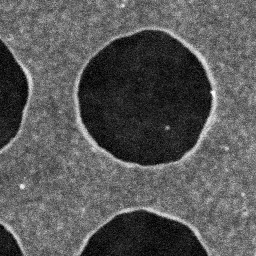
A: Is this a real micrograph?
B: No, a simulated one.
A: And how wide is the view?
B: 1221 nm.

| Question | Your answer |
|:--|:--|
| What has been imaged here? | holes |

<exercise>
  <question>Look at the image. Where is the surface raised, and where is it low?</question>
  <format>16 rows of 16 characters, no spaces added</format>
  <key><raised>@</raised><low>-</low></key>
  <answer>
@@@@@@@@@@@@@@@@
@@@@@@@@@@@@@@@@
@@@@@@@----@@@@@
-@@@@@------@@@@
--@@@--------@@@
--@@@--------@@@
--@@@--------@@@
-@@@@--------@@@
-@@@@@-------@@@
@@@@@@@-----@@@@
@@@@@@@@@@@@@@@@
@@@@@@@@@@@@@@@@
@@@@@@@@@@@@@@@@
@@@@@@@---@@@@@@
-@@@@@------@@@@
-@@@@--------@@@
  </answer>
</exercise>